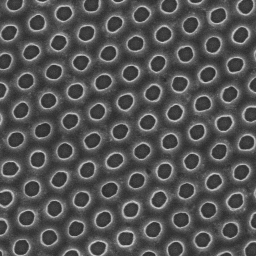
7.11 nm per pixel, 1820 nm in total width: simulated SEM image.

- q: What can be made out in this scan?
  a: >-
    a regular array of holes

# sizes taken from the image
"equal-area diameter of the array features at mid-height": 111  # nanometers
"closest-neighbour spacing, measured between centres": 205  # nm